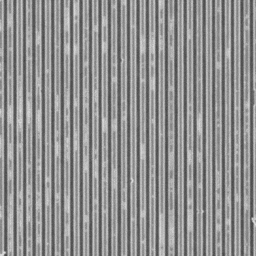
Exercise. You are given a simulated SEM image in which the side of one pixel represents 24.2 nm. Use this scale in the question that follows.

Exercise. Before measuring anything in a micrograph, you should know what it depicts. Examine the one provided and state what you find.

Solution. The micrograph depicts parallel lines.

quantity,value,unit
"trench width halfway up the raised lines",0.109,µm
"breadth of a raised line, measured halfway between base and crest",0.127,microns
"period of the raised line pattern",229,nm